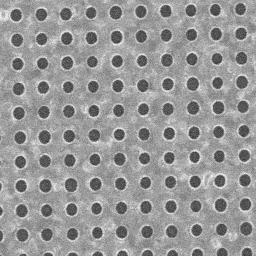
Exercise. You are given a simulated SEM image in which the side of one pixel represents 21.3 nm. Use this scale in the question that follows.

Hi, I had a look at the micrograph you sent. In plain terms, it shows a regular array of holes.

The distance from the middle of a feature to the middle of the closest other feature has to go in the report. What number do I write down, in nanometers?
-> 516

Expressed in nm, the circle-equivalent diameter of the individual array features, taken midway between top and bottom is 266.